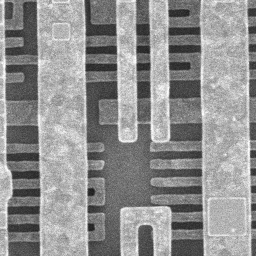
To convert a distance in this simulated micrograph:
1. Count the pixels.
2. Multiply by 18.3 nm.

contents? wiring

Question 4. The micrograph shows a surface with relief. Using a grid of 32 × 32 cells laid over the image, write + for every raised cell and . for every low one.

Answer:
.....++++++....++..++....++++++.
.....++++++....++..++....++++++.
.....++++++....++..++....++++++.
.....++++++....++..++....++++++.
+....++++++....++..++....++++++.
+....++++++....++..++....++++++.
+....++++++....++..++....++++++.
+....++++++....++..++....++++++.
+....++++++....++..++....++++++.
+....++++++....++..++....++++++.
+....++++++....++..++....++++++.
+....++++++....++..++....++++++.
+....++++++....++..++....++++++.
+....++++++....++..++....++++++.
+....++++++....++..++....++++++.
+....++++++....++..++....++++++.
+....++++++....++..++....++++++.
+....++++++....++..++....++++++.
+....++++++..............++++++.
+....++++++..............++++++.
+....++++++..............++++++.
+....++++++..............++++++.
+....++++++..............++++++.
++...++++++..............++++++.
+....++++++..............++++++.
+....++++++..............++++++.
+....++++++....++++++....++++++.
+....++++++....++++++....++++++.
+....++++++....++..++....++++++.
+....++++++....++..++....++++++.
+....++++++....++..++.....+++++.
+....++++++....++..++.....+++++.